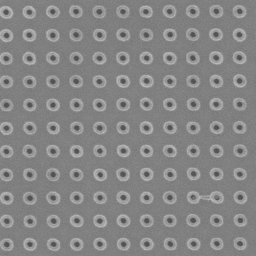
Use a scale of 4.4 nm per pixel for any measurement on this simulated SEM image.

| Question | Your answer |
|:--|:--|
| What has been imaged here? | a regular array of ring-shaped raised bodies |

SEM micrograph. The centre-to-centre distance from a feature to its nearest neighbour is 101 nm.